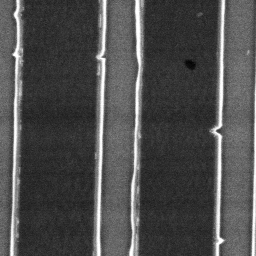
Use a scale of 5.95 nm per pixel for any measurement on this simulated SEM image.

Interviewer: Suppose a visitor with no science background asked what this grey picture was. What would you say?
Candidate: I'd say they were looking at one or a few lines or trenches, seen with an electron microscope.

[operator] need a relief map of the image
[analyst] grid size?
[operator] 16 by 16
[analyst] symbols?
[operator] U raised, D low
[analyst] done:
DUUUUUUDDUUUUUDD
DUUUUUUDDUUUUUDD
DUUUUUDDDUUUUUDD
DUUUUUDDDUUUUUDD
DUUUUUDDDUUUUUDD
DUUUUUDDDUUUUUDD
DUUUUUDDDUUUUUDD
DUUUUUDDDUUUUUDD
DUUUUUDDUUUUUUDD
DUUUUUDDUUUUUUDD
DUUUUUDDUUUUUUDD
DUUUUUDDUUUUUUDD
DUUUUUDDUUUUUUDD
DUUUUUDDUUUUUUDD
DUUUUUDDUUUUUUDD
DUUUUUDDUUUUUUDD